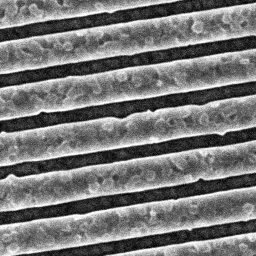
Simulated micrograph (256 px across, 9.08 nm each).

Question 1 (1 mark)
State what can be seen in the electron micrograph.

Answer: parallel lines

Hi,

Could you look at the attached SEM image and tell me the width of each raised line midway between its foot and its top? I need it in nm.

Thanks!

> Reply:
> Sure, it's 285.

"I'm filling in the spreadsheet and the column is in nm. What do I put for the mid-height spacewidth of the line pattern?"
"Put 131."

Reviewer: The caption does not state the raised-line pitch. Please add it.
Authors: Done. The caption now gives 45.4 pixels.